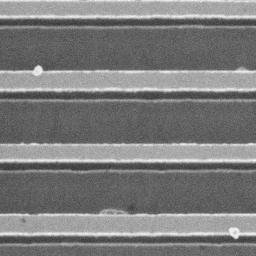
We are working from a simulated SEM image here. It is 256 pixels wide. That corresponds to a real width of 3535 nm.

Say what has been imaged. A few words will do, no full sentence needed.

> lines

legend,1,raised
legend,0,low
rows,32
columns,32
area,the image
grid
11111111111111111111111111111111
11111111111111111111111111111111
00000000000000000000000000000000
00000000000000000000000000000000
00000000000000000000000000000000
00000000000000000000000000000000
00000000000000000000000000000000
00000000000000000000000000000000
00001000000000000000000000000000
11111111111111111111111111111111
11111111111111111111111111111111
00000000000000000000000000000000
00000000000000000000000000000000
00000000000000000000000000000000
00000000000000000000000000000000
00000000000000000000000000000000
00000000000000000000000000000000
00000000000000000000000000000000
11111111111111111111111111111111
11111111111111111111111111111111
00000000000000000000000000000000
00000000000000000000000000000000
00000000000000000000000000000000
00000000000000000000000000000000
00000000000000000000000000000000
00000000000000000000000000000000
00000000000000000000000000000000
11111111111111111111111111111111
11111111111111111111111111111111
00000000000000000000000000000100
00000000000000000000000000000000
00000000000000000000000000000000